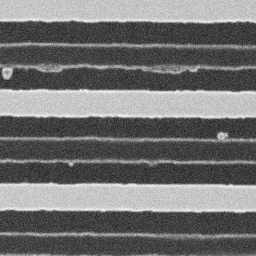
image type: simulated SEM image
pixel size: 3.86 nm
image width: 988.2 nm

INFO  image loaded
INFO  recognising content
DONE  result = lines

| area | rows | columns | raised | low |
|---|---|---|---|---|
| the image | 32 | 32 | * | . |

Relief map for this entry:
********************************
********************************
********************************
................................
................................
...****.........................
********************************
********************************
**...***..........*****.*....*..
*...............................
................................
*****************************.**
********************************
********************************
....**.****.********************
................................
................................
********************************
********************************
********************************
................................
................................
................................
********************************
********************************
********************************
................................
................................
................................
*********************......*****
********************************
********************************